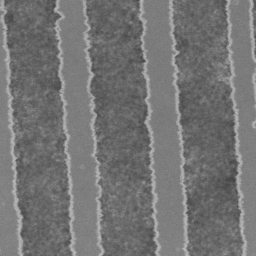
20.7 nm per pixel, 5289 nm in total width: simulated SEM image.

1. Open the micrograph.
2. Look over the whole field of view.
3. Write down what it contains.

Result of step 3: one or a few lines or trenches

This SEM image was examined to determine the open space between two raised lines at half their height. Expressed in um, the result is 1.14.